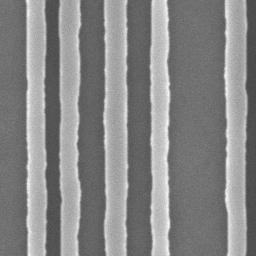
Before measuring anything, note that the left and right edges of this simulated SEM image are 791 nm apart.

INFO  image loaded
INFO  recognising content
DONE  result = lines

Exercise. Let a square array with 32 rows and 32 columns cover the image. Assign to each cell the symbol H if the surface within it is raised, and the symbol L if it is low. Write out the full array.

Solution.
LLLHHHLLHHLLLHHHLLLHHLLLLLLLHHHL
LLLHHHLHHHLLLHHHLLLHHLLLLLLLHHHL
LLLHHHLHHHLLLHHHLLLHHLLLLLLLHHHL
LLLHHHLHHHLLLHHHLLLHHLLLLLLLHHHL
LLLHHHLHHHLLLHHHLLLHHLLLLLLLHHHL
LLLHHHLLHHLLLHHHLLLHHLLLLLLLHHHL
LLLHHHLLHHLLLHHHLLLHHLLLLLLLHHHL
LLLHHHLLHHLLLHHHLLLHHLLLLLLLHHHL
LLLHHHLLHHLLLHHHLLLHHLLLLLLLHHHL
LLLHHHLLHHLLLHHHLLLHHLLLLLLLHHHL
LLLLHHLLHHLLLHHHLLLHHLLLLLLLHHHL
LLLHHHLLHHLLLHHHLLLHHLLLLLLLHHHL
LLLHHHLLHHLLLHHHLLLHHLLLLLLLHHHL
LLLHHHLLHHLLLHHHLLLHHLLLLLLLHHHL
LLLHHHLLHHLLLHHHLLLHHLLLLLLLHHHL
LLLHHHLLHHLLLHHHLLLHHLLLLLLLHHHL
LLLHHHLLHHLLLHHHLLLHHLLLLLLLHHHL
LLLHHHLLHHLLLHHHLLLHHLLLLLLLHHHL
LLLHHHLLHHLLLHHHLLLHHLLLLLLLHHHL
LLLLHHLHHHLLLHHHLLLHHLLLLLLLHHHL
LLLHHHLHHHLLLHHHLLLHHLLLLLLLHHHL
LLLHHHLLHHLLLHHHLLLHHLLLLLLLHHHL
LLLHHHLLHHLLLHHHLLLHHLLLLLLLHHHL
LLLHHHLLHHLLLHHHLLLHHLLLLLLLHHHL
LLLHHHLLHHLLLHHHLLLHHLLLLLLLHHHL
LLLHHHLLHHLLLHHHLLLHHLLLLLLLHHHL
LLLLHHLLHHLLLHHHLLLHHLLLLLLLHHHL
LLLHHHLLHHLLLHHHLLLHHLLLLLLLLHHL
LLLHHHLLHHLLLHHHLLLHHLLLLLLLLHHL
LLLLHHLLHHLLLHHHLLLHHLLLLLLLLHHL
LLLLHHLLHHLLLHHHLLLHHLLLLLLLLHHL
LLLLHHLLHHLLLHHHLLLHHLLLLLLLHHHL